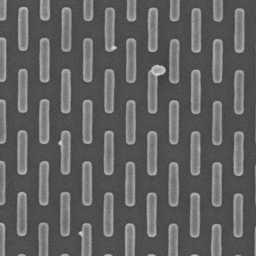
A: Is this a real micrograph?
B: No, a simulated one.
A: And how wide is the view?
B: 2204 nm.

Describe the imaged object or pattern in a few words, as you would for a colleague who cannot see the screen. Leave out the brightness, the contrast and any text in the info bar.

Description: groups of lines, slits or small figures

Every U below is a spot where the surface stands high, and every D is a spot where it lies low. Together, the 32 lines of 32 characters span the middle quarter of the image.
DDDDDUUDDDDDDDDDUUDDDDDUDDUUUDDD
UDDDDUUDDDDUDDDDUUDDDDUUUDUUUDDD
UDDDDUUDDDUUDDDDUUDDDUUUUDUUUDDD
UDDDDUUDDDUUDDDDUUDDDUUDDDUUUDDD
UDDDDDDDDDUUUDDDUDDDDUUDDDDUDDDD
UDDDDDDDDDUUDDDDDDDDDUUDDDDDDDDD
UUDDDDDDDDUUDDDDDDDDDUUDDDDDDDDD
UUDDDDDDDDUUDDDDDDDDDUUDDDDDDDDD
UUDDDDDDDDUUDDDDDDDDDUUDDDDDDDDD
UDDDDUUDDDUUDDDDUUDDDUUDDDDUDDDD
UDDDDUUDDDUUDDDDUUDDDUUDDDUUUDDD
UDDDDUUDDDUUDDDDUUDDDUUDDDUUUDDD
DDDDDUUDDDDDDDDDUUDDDDDDDDUUUDDD
DDDDDUUDDDDDDDDDUUDDDDDDDDUUUDDD
DDDDDUUDDDDDDDDDUUDDDDDDDDUUUDDD
DDDDDUUDDDDDDDDDUUDDDDDDDDUUUDDD
DDDDDUUDDDDDDDDDUUDDDDDDDDUUUDDD
UDDDDUUDDDUUDDDDUUDDDUUDDDUUUDDD
UDDDDUUDDDUUDDDDUUDDDUUDDDUUDDDD
UDDDDUUDDDUUDDDDUUDDDUUDDDDUDDDD
UDDDDDDDDDUUDDDDDDDDDUUDDDDDDDDD
UDDDDDDDDDUUDDDDDDDDDUUDDDDDDDDD
UDDDDDDDDDUUDDDDDDDDDUUDDDDDDDDD
UDDDDDDDDDUUDDDDDDDDDUUDDDDDDDDD
UDDDDUDDDDUUDDDDDDDDDUUDDDDDDDDD
UDDDDUUDDDUUDDDDUUDDDUUDDDUUDDDD
UDDDDUUDDDUUDDDDUUDDDUUDDDUUDDDD
UDDDDUUDDDUUDDDDUUDDDUUDDDUUDDDD
DDDDDUUDDDDDDDDDUUDDDDDDDDUUUDDD
DDDDDUUDDDDDDDDUUUDDDDDDDDUUUDDD
DDDDDUUDDDDDDDDUUUDDDDDDDDUUUDDD
DDDDDUUDDDDDDDDUUUDDDDDDDDUUUDDD